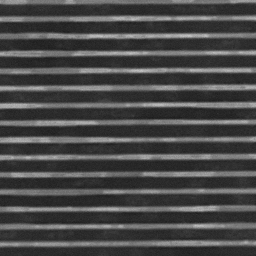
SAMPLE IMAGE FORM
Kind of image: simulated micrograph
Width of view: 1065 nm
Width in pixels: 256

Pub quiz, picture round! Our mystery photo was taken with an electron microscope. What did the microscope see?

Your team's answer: parallel lines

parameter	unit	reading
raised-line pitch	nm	72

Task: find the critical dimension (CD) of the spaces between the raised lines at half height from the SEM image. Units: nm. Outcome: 53.5